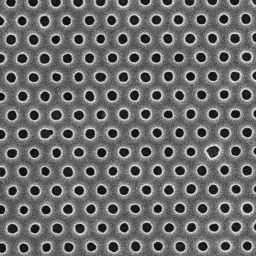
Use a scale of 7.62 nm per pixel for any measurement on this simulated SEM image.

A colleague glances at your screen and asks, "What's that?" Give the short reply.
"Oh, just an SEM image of a regular array of holes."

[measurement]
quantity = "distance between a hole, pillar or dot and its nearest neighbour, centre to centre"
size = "21.5 px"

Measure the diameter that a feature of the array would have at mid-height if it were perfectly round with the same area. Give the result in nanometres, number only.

75